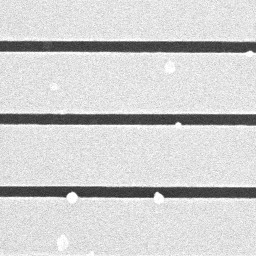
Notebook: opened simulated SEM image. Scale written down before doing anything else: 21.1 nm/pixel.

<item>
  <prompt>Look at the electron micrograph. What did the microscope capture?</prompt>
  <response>lines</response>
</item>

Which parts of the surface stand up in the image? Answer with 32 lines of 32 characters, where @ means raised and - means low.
@@@@@@@@@@@@@@@@@@@@@@@@@@@@@@@@
@@@@@@@@@@@@@@@@@@@@@@@@@@@@@@@@
@@@@@@@@@@@@@@@@@@@@@@@@@@@@@@@@
@@@@@@@@@@@@@@@@@@@@@@@@@@@@@@@@
@@@@@@@@@@@@@@@@@@@@@@@@@@@@@@@@
--------------------------------
--------------------------------
@@@@@@@@@@@@@@@@@@@@@@@@@@@@@@@@
@@@@@@@@@@@@@@@@@@@@@@@@@@@@@@@@
@@@@@@@@@@@@@@@@@@@@@@@@@@@@@@@@
@@@@@@@@@@@@@@@@@@@@@@@@@@@@@@@@
@@@@@@@@@@@@@@@@@@@@@@@@@@@@@@@@
@@@@@@@@@@@@@@@@@@@@@@@@@@@@@@@@
@@@@@@@@@@@@@@@@@@@@@@@@@@@@@@@@
--------------------------------
----------------------@---------
@@@@@@@@@@@@@@@@@@@@@@@@@@@@@@@@
@@@@@@@@@@@@@@@@@@@@@@@@@@@@@@@@
@@@@@@@@@@@@@@@@@@@@@@@@@@@@@@@@
@@@@@@@@@@@@@@@@@@@@@@@@@@@@@@@@
@@@@@@@@@@@@@@@@@@@@@@@@@@@@@@@@
@@@@@@@@@@@@@@@@@@@@@@@@@@@@@@@@
@@@@@@@@@@@@@@@@@@@@@@@@@@@@@@@@
--------------------------------
--------@@---------@------------
@@@@@@@@@@@@@@@@@@@@@@@@@@@@@@@@
@@@@@@@@@@@@@@@@@@@@@@@@@@@@@@@@
@@@@@@@@@@@@@@@@@@@@@@@@@@@@@@@@
@@@@@@@@@@@@@@@@@@@@@@@@@@@@@@@@
@@@@@@@@@@@@@@@@@@@@@@@@@@@@@@@@
@@@@@@@@@@@@@@@@@@@@@@@@@@@@@@@@
@@@@@@@@@@@@@@@@@@@@@@@@@@@@@@@@